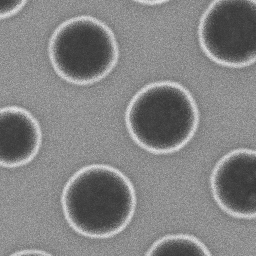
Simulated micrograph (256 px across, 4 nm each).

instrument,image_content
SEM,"raised bodies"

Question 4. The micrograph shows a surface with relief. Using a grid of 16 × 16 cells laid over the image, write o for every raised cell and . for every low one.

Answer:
o............ooo
....oo.......ooo
...oooo......ooo
...oooo......ooo
....ooo.........
.........oo.....
........oooo....
oo......oooo....
oo......oooo....
oo.............o
.....oo.......oo
....oooo.....ooo
....oooo......oo
....oooo.......o
.....oo.........
..........ooo...